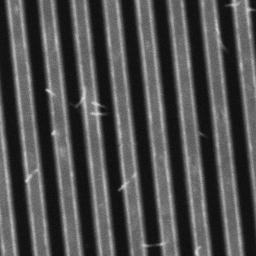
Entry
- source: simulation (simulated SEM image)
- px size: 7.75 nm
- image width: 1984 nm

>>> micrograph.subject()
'parallel lines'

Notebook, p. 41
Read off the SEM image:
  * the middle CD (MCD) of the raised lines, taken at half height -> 0.12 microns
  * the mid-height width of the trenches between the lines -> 16.4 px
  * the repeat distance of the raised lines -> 249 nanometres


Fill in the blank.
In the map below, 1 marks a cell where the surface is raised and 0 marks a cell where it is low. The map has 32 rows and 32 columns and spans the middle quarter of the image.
00001110000011100000111100001111
00001110000011100000111100001111
00001111000011110000111100001111
00001111000011110000111100001111
00001111000011110000111100001111
00001111000011110000111100001111
00001111000011110000111100000111
00001111000011110000111100000111
00001111000011110000011100000111
00001111000001110000011110000111
00000111100001110000011110000111
00000111100001111000011110000111
10000111100001111000011110000111
10000111100001111000011110000111
10000111100001111000011110000111
10000111100001111000011110000011
10000111100001111000011110000011
10000111100001111000011110000011
10000011100000111000001110000011
10000011100000111100001110000011
10000011100000111100001111000011
11000011110000111100001111000011
11000011110000111100001111000011
11000011110000111100001111000011
11000011110000111100001111000011
11000011110000111100001111000001
11000011110000111100001111000001
11000001110000011100000111000001
11000001110000011100000111000001
11000001110000011100000111000001
11100001111000111110000111100001
11100001111000011110000111100001